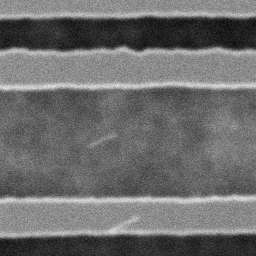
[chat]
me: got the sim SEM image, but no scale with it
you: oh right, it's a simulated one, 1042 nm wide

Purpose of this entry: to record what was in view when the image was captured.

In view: lines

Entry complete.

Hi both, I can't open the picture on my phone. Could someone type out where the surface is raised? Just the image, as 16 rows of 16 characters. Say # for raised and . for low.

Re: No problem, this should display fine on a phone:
################
................
................
################
################
###.............
................
................
................
................
................
................
################
################
################
................